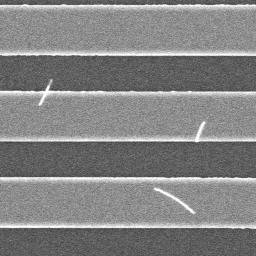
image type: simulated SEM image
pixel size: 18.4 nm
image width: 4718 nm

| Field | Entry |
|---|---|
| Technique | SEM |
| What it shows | lines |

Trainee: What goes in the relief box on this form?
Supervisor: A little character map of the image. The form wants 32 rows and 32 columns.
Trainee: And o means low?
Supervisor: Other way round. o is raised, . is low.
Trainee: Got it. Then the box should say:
................................
oooooooooooooooooooooooooooooooo
oooooooooooooooooooooooooooooooo
oooooooooooooooooooooooooooooooo
oooooooooooooooooooooooooooooooo
oooooooooooooooooooooooooooooooo
oooooooooooooooooooooooooooooooo
................................
................................
................................
................................
ooooooooo.ooo...o...oo.o........
oooooooooooooooooooooooooooooooo
oooooooooooooooooooooooooooooooo
oooooooooooooooooooooooooooooooo
oooooooooooooooooooooooooooooooo
oooooooooooooooooooooooooooooooo
oooooooooooooooooooooooooooooooo
................................
................................
................................
................................
oooooooooooooooooooooooooooooooo
oooooooooooooooooooooooooooooooo
oooooooooooooooooooooooooooooooo
oooooooooooooooooooooooooooooooo
oooooooooooooooooooooooooooooooo
oooooooooooooooooooooooooooooooo
.............................ooo
................................
................................
................................